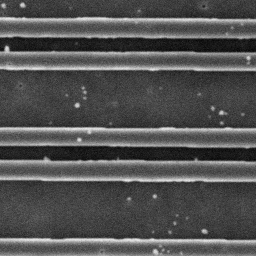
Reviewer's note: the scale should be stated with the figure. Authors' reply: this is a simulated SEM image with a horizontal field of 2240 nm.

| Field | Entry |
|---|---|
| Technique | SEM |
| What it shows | lines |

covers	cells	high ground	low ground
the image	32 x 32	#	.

................................
................................
################################
################################
################################
................................
......#.........................
################################
################################
................................
................................
................................
................................
................................
................................
................................
################################
################################
................................
................................
################################
################################
.....###########################
................................
................................
................................
................................
................................
................................
................................
################################
################################